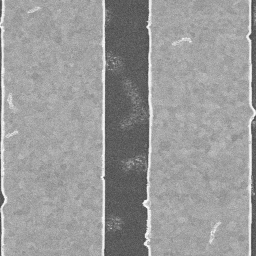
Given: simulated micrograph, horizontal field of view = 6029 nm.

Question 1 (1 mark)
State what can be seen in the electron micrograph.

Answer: one or a few lines or trenches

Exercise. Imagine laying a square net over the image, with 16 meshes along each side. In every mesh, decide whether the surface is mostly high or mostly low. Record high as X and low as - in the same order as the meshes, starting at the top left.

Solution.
XXXXXX---XXXXXXX
XXXXXX---XXXXXXX
XXXXXX---XXXXXXX
XXXXXXX--XXXXXXX
XXXXXXX--XXXXXXX
XXXXXX---XXXXXXX
XXXXXX---XXXXXXX
XXXXXX---XXXXXXX
XXXXXX---XXXXXXX
XXXXXX---XXXXXXX
XXXXXX---XXXXXXX
XXXXXX---XXXXXXX
XXXXXX---XXXXXXX
XXXXXX---XXXXXXX
XXXXXX---XXXXXXX
XXXXXX---XXXXXXX